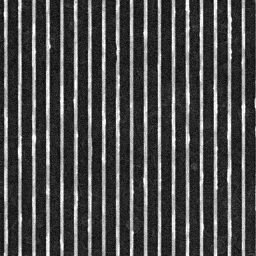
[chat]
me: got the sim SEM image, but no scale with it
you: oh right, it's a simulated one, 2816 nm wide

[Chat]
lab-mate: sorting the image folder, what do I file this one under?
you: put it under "parallel lines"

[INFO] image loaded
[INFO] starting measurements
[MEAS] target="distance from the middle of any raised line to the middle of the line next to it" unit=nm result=154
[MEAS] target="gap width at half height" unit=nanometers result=120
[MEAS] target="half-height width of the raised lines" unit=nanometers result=31.6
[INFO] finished